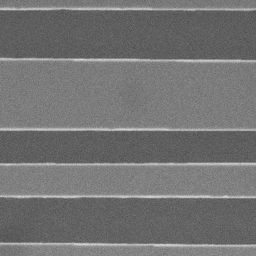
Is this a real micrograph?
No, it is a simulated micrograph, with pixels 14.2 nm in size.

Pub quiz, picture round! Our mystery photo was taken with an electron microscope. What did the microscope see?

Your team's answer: lines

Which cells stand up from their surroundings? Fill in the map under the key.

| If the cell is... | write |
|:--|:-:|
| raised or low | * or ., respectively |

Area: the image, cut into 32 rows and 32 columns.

********************************
................................
................................
................................
................................
................................
................................
***********.....................
********************************
********************************
********************************
********************************
********************************
********************************
********************************
********************************
................................
................................
................................
................................
................................
********************************
********************************
********************************
********************************
................................
................................
................................
................................
................................
**********......................
********************************